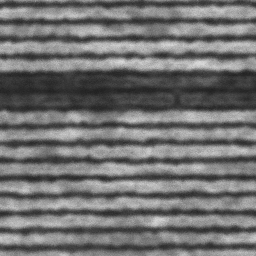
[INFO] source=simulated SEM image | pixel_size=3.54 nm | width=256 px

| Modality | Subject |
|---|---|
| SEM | parallel lines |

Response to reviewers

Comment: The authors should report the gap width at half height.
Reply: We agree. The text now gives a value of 27.8 nm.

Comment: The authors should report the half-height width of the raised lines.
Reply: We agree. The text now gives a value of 34.5 nm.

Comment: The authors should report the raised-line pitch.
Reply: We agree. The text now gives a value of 61.4 nm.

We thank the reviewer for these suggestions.